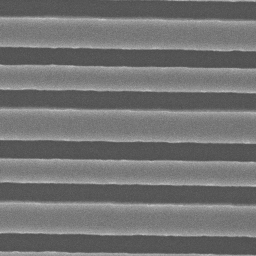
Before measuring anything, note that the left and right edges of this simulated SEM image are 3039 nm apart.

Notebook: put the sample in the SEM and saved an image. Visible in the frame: lines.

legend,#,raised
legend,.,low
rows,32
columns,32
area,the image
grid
................................
................................
##############..................
################################
################################
################################
................................
................................
########################........
################################
################################
...............................#
................................
................................
################################
################################
################################
........########################
................................
................................
################################
################################
################################
................................
................................
#####...........................
################################
################################
################################
............................#..#
................................
###..##.........................